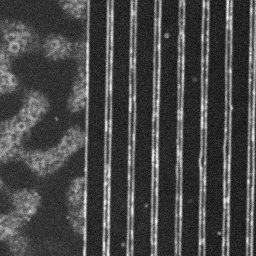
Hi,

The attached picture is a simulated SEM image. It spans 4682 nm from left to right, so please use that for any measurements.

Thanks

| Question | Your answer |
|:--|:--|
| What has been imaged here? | parallel lines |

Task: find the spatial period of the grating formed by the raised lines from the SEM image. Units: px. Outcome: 23.9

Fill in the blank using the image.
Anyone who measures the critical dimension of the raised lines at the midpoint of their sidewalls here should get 4.75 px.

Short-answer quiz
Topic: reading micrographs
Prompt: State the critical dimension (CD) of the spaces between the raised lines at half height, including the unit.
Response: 0.347 um